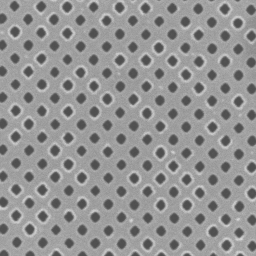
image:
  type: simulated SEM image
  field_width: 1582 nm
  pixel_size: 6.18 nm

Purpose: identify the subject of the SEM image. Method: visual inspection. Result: a regular array of holes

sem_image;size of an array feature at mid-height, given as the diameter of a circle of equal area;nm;59.6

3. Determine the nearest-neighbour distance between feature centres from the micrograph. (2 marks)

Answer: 112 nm